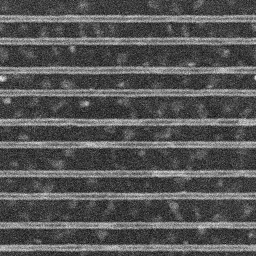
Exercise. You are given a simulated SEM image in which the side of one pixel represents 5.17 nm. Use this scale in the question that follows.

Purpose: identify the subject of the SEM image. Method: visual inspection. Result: parallel lines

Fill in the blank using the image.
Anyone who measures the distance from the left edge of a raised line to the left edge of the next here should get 132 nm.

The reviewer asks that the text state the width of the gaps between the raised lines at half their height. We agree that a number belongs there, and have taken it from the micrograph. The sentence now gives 0.0892 um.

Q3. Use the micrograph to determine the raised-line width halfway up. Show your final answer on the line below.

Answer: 0.0278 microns